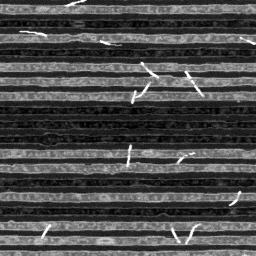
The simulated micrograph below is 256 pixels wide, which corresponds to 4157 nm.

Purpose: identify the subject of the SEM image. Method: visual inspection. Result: parallel lines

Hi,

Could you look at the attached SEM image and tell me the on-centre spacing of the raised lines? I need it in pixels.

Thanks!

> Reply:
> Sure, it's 14.5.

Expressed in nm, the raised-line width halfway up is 132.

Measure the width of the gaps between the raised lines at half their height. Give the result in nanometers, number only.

106